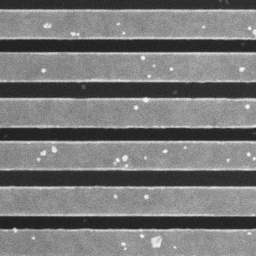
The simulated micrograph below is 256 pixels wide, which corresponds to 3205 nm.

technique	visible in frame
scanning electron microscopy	lines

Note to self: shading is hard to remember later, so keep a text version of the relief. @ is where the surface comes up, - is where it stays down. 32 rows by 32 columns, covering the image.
--------------------------------
@@@@@@@@@@@@@@@@@@@@@@@@@@@@@@@@
@@@@@@@@@@@@@@@@@@@@@@@@@@@@@@@@
@@@@@@@@@@@@@@@@@@@@@@@@@@@@@@@@
@@@@@@@@@@@@@@@@@@@@@@@@@@@@@@@@
--------------------------------
--------------------------------
@@@@@@@@@@@@@@@@@@@@@@@@@@@@@@@@
@@@@@@@@@@@@@@@@@@@@@@@@@@@@@@@@
@@@@@@@@@@@@@@@@@@@@@@@@@@@@@@@@
--------------------------------
--------------------------------
@@@@@@@@@@@@@@@@@@@@@@@@@@@@@@@@
@@@@@@@@@@@@@@@@@@@@@@@@@@@@@@@@
@@@@@@@@@@@@@@@@@@@@@@@@@@@@@@@@
@@@@@@@@@@@@@@@@@@@@@@@@@@@@@@@@
--------------------------------
--------------------------------
@@@@@@@@@@@@@@@@@@@@@@@@@@@@@@@@
@@@@@@@@@@@@@@@@@@@@@@@@@@@@@@@@
@@@@@@@@@@@@@@@@@@@@@@@@@@@@@@@@
--------------------------------
--------------------------------
@@@@@@@@@@@@@@@@@@@@@@@@@@@@@@@@
@@@@@@@@@@@@@@@@@@@@@@@@@@@@@@@@
@@@@@@@@@@@@@@@@@@@@@@@@@@@@@@@@
@@@@@@@@@@@@@@@@@@@@@@@@@@@@@@@@
--------------------------------
--------------------------------
@@@@@@@@@@@@@@@@@@@@@@@@@@@@@@@@
@@@@@@@@@@@@@@@@@@@@@@@@@@@@@@@@
@@@@@@@@@@@@@@@@@@@@@@@@@@@@@@@@